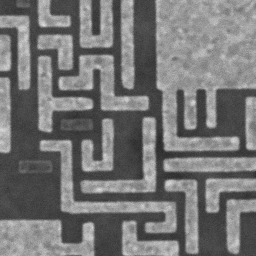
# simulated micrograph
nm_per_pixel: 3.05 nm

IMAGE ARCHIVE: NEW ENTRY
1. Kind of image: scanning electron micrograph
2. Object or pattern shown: wiring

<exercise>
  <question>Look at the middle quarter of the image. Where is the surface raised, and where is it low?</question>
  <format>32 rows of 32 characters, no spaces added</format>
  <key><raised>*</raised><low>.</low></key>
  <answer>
**..********...**......*********
....***..***...**......*********
....***..***...**......*********
*******..***...**......*********
*******..***...**......*********
*******..***...**......*********
.........***............****..**
..........**.............***..**
*****.....***********....***..**
*******...***********....***..**
*******...***********....***..**
**.......................***..**
.........................***..**
.........................***..**
*******...**........***..***..**
*******...**........***..***..**
..........**........***..***....
..........**........***..***....
..........**........***..****...
**...**...**........***..*******
**...**...**........***..*******
**...**...**........***..*******
**...**...**........***.........
**...**...**........***.........
**...*******........***..*******
**...*******........***..*******
**...*******........***..*******
**..................***.........
**..................***.........
**...******************..*******
**..*******************..*******
**...******************...******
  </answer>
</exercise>